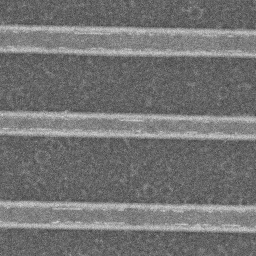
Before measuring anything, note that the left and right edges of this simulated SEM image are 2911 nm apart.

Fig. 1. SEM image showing one or a few lines or trenches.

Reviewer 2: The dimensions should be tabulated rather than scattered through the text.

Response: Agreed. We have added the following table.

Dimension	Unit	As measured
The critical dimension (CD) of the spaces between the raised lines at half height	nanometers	777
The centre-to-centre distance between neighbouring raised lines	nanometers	997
